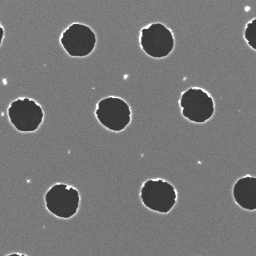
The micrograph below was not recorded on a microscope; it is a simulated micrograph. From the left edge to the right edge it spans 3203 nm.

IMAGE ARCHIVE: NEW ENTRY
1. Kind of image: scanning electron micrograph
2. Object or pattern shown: holes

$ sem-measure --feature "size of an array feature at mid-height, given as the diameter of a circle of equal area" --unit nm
414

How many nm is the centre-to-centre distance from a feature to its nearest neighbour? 1020